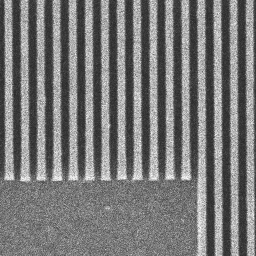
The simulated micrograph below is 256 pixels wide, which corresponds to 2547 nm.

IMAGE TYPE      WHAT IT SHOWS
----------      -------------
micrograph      parallel lines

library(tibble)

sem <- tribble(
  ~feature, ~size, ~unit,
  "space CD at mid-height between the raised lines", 74.6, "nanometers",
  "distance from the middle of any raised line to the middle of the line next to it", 160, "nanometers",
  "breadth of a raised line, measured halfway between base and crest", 0.0833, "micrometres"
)